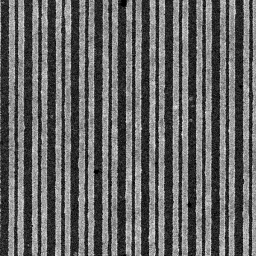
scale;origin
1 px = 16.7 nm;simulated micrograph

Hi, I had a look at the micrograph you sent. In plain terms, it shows parallel lines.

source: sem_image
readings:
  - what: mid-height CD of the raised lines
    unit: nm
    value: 87.5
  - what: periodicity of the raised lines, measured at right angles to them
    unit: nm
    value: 196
